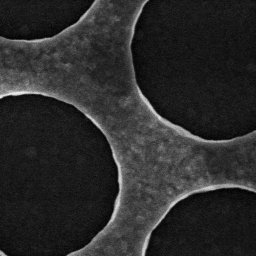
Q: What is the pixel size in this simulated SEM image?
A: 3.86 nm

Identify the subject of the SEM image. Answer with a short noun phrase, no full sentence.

holes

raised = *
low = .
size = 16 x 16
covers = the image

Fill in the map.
......***.......
.....***........
*..*****........
********........
********........
*********.......
....*****.......
......****......
.......*****...*
.......*********
.......*********
.......*********
.......****.....
.......***......
......***.......
.....****.......